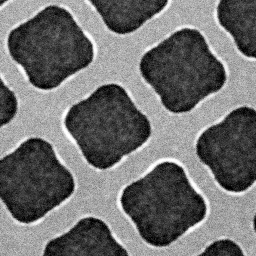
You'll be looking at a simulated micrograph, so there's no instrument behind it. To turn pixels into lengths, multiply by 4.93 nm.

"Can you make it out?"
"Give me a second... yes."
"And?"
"holes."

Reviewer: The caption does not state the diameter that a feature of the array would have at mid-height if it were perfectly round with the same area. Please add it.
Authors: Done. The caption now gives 395 nm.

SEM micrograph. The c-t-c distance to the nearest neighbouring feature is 469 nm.